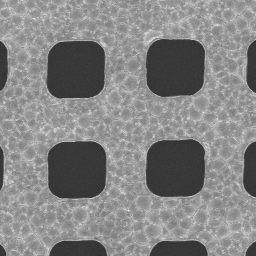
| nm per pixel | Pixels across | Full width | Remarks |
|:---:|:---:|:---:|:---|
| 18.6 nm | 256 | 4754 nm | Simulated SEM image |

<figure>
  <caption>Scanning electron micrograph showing holes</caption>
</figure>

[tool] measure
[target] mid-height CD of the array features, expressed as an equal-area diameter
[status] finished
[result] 1160 nm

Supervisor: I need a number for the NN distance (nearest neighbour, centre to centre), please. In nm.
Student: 1840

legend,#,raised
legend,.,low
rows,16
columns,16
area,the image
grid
################
################
##########..####
###....##....##.
###....##....##.
###...###....###
################
################
################
###....##....##.
###....##....##.
###....##....##.
################
################
################
###...####...###